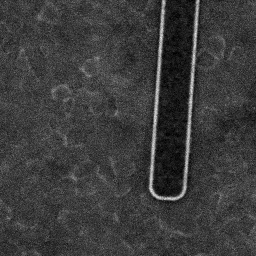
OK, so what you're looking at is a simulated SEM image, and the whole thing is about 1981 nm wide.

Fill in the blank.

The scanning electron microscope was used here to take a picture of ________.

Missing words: one or a few lines or trenches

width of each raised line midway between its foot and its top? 266 nm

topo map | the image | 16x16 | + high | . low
..........++....
..........++....
..........++....
..........++....
..........++....
..........++....
..........++....
..........++....
..........++....
..........++....
.........+++....
.........+++....
................
................
................
................